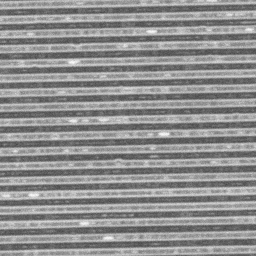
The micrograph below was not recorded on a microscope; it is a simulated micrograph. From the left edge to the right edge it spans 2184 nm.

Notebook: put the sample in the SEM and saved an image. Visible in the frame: parallel lines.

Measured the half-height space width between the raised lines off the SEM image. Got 68.2 nm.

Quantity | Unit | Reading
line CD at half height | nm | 59.7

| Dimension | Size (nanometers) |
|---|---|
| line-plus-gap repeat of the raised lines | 125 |